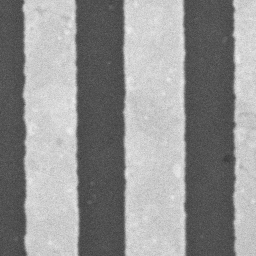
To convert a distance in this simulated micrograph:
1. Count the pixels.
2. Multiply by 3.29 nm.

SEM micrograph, lines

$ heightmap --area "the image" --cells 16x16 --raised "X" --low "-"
--XXX---XXX----X
--XXX---XXX----X
--XXX---XXX----X
--XXX---XXXX---X
--XXX---XXX----X
--XXX---XXX----X
--XXX---XXX----X
--XXX---XXXX---X
--XXX---XXXX---X
--XXX---XXXX---X
--XXX---XXXX---X
--XXX---XXXX---X
--XXX---XXXX---X
--XXX---XXXX---X
--XXX---XXXX---X
--XXX---XXXX---X